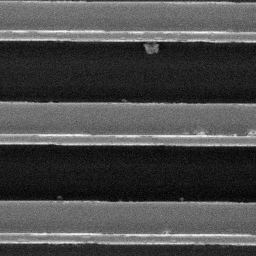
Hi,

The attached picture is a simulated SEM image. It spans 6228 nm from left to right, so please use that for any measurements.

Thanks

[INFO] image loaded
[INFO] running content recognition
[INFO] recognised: lines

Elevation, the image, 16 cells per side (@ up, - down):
@@@@@@@@@@@@@@@@
@@@@@@@@@@@@@@@@
------@@@@@@@@@@
----------------
----------------
----------------
@@@@@@@@@-------
@@@@@@@@@@@@@@@@
@@@@@@@@@@@@@@@@
----------------
----------------
----------------
----------------
@@@@@@@@@@@@@@@@
@@@@@@@@@@@@@@@@
----------------